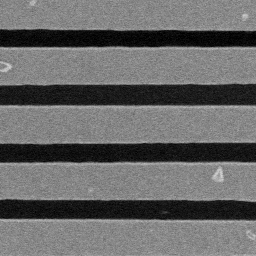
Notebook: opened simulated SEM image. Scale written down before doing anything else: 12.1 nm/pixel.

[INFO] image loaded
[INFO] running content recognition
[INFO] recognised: lines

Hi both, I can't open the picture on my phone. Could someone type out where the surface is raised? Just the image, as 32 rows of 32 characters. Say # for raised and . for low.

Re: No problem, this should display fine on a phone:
################################
################################
################################
################################
................................
................................
################################
################################
################################
################################
#############################.#.
................................
................................
################################
################################
################################
################################
################################
................................
................................
################################
################################
################################
################################
################################
................................
................................
#################...............
################################
################################
################################
################################